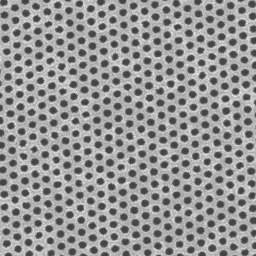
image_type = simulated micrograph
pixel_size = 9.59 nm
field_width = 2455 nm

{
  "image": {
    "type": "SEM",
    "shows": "a regular array of holes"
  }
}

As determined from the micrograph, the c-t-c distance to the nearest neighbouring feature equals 116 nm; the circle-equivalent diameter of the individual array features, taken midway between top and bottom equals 78.8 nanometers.